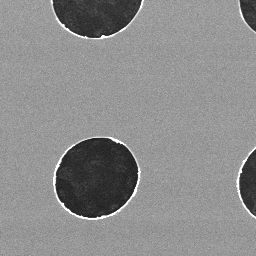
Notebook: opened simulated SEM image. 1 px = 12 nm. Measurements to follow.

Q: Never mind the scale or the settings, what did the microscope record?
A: holes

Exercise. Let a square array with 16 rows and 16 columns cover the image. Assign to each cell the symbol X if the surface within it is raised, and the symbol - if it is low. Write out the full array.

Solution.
XXX------XXXXXX-
XXXX----XXXXXXX-
XXXXXXXXXXXXXXXX
XXXXXXXXXXXXXXXX
XXXXXXXXXXXXXXXX
XXXXXXXXXXXXXXXX
XXXXXXXXXXXXXXXX
XXXXXXXXXXXXXXXX
XXXXXXXXXXXXXXXX
XXXX----XXXXXXXX
XXXX-----XXXXXX-
XXX------XXXXXX-
XXXX----XXXXXXX-
XXXXX--XXXXXXXXX
XXXXXXXXXXXXXXXX
XXXXXXXXXXXXXXXX